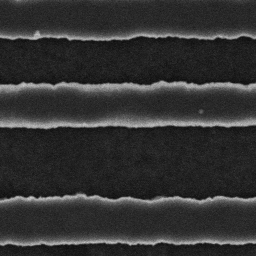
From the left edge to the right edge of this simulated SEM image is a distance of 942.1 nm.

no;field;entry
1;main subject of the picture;lines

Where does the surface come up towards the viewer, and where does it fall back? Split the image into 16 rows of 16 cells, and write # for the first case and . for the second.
################
################
.....##.........
................
................
################
################
################
................
................
................
................
#########.######
################
################
................